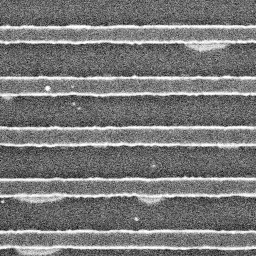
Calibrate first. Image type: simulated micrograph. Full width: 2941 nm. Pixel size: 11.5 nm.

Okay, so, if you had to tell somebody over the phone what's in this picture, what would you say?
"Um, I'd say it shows lines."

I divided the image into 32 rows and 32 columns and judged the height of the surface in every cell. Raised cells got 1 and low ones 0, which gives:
00000000000000000000000000000000
00000000000000000000000000000000
00000000000000000000000000000000
11111111111111111111111111111111
11111111111111111111111111111111
00000000000000000000000000000000
00000000000000000000000000000000
00000000000000000000000000000000
00000000000000000000000000000000
00000000000000000000000000000000
11111111111111111111111111111111
11111111111111111111111111111111
00000000000000000000000000000000
00000000000000000000000000000000
00000000000000000000000000000000
00000000000000000000000000000000
11111111111111111111111111111111
11111111111111111111111111111111
00000000000000000000000000000000
00000000000000000000000000000000
00000000000000000000000000000000
00000000000000000000000000000000
11111111111111111111111111111111
11111111111111111111111111111111
10000000001101000011010000000000
00000000000000000000000000000000
00000000000000000000000000000000
00000000000000000000000000000000
00000000000000000000000000000000
11111111111111111111111111111111
11111111111111111111111111111111
00000000000000000000000000000000